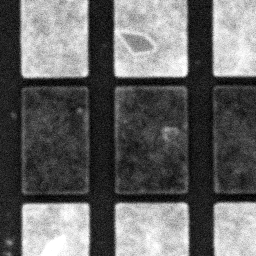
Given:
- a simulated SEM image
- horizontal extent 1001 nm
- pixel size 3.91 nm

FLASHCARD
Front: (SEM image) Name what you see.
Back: wiring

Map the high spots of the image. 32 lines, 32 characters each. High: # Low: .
...########...#########....#####
...########...#########....#####
...########...#########....#####
...########...#########....#####
...########...#########....#####
...########...#########....#####
...########...#########....#####
...########...#########....#####
...########...#########....#####
...#####........................
................................
...########...#########....#####
...########...#########....#####
...########...#########....#####
...########...#########....#####
...########...#########....#####
...########...#########....#####
...########...#########....#####
...########....########....#####
...########....########....#####
...########....########....#####
...########....########....#####
...########....########....#####
...########....########....#####
................................
......................#....#####
...########....########....#####
...########....########....#####
...########....########....#####
...########....########....#####
...########....########....#####
...########....########....#####